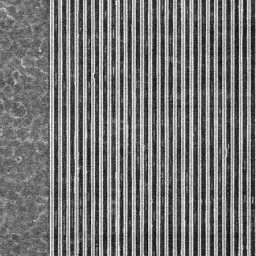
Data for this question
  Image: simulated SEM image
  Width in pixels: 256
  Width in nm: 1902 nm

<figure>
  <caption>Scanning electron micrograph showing parallel lines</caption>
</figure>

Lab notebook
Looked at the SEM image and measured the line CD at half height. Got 25.1 nanometers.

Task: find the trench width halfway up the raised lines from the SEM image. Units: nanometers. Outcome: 37.1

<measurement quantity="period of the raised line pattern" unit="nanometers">61.1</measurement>